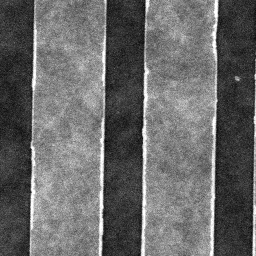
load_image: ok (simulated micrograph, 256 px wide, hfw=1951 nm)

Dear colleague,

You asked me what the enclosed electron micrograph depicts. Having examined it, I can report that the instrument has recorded one or a few lines or trenches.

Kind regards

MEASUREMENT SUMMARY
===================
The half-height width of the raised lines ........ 542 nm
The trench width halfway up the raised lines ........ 0.3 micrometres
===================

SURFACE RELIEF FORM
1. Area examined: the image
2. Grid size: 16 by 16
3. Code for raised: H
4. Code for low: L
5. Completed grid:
LLHHHHHLLHHHHHLL
LLHHHHHLLHHHHHLL
LLHHHHHLLHHHHLLL
LLHHHHHLLHHHHHLL
LLHHHHHLLHHHHHLL
LLHHHHHLLHHHHLLL
LLHHHHHLLHHHHHLL
LLHHHHLLLHHHHLLL
LLHHHHLLLHHHHLLL
LLHHHHLLLHHHHLLL
LLHHHHLLLHHHHLLL
LLHHHHLLLHHHHLLL
LLHHHHLLLHHHHLLL
LLHHHHLLLHHHHLLL
LLHHHHLLLHHHHLLL
LLHHHHLLLHHHHLLL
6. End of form